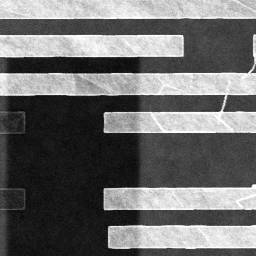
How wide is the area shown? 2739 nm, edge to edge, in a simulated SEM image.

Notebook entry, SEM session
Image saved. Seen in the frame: wiring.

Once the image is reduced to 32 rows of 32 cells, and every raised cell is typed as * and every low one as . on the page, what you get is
********************************
********************************
................................
................................
.........****....******.........
***********************.........
***********************.........
................................
................................
********************************
********************************
********************************
................................
................................
***..........*******************
***..........*******************
***..........**************....*
................................
................................
................................
................................
................................
................................
...............................*
***..........*******************
***..........*******************
................................
................................
..............******************
..............******************
..............******************
................................